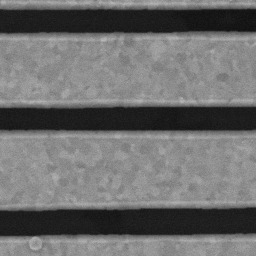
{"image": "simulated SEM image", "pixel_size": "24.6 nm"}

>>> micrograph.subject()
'lines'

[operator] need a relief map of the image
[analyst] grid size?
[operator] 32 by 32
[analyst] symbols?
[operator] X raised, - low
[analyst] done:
XXXXXXXXXXXXXXXXXXXXXXXXXXXXXXXX
--------------------------------
--------------------------------
--------------------------------
-----XXX----XXXXXXXXXXXXXXXXXXXX
XXXXXXXXXXXXXXXXXXXXXXXXXXXXXXXX
XXXXXXXXXXXXXXXXXXXXXXXXXXXXXXXX
XXXXXXXXXXXXXXXXXXXXXXXXXXXXXXXX
XXXXXXXXXXXXXXXXXXXXXXXXXXXXXXXX
XXXXXXXXXXXXXXXXXXXXXXXXXXXXXXXX
XXXXXXXXXXXXXXXXXXXXXXXXXXXXXXXX
XXXXXXXXXXXXXXXXXXXXXXXXXXXXXXXX
XXXXXXXXXXXXXXXXXXXXXXXXXXXXXXXX
--------------------------------
--------------------------------
--------------------------------
--------------------------------
XXXXXXXXXXXXXXXXXXXXXXXXXXXXXXXX
XXXXXXXXXXXXXXXXXXXXXXXXXXXXXXXX
XXXXXXXXXXXXXXXXXXXXXXXXXXXXXXXX
XXXXXXXXXXXXXXXXXXXXXXXXXXXXXXXX
XXXXXXXXXXXXXXXXXXXXXXXXXXXXXXXX
XXXXXXXXXXXXXXXXXXXXXXXXXXXXXXXX
XXXXXXXXXXXXXXXXXXXXXXXXXXXXXXXX
XXXXXXXXXXXXXXXXXXXXXXXXXXXXXXXX
XXXXXXXXXXXXXXXXXXXXXXXXXXXXXXXX
--------------------------------
--------------------------------
--------------------------------
--------------------------------
XXXXXXXXXXXXXXXXXXXXXXXXXXXXXXXX
XXXXXXXXXXXXXXXXXXXXXXXXXXXXXXXX